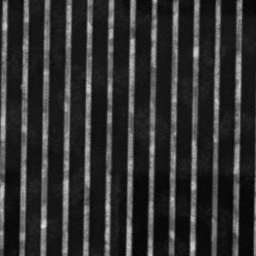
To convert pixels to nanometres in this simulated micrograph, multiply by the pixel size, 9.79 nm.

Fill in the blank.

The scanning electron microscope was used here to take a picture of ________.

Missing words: parallel lines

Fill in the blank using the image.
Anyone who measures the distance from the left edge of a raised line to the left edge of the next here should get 208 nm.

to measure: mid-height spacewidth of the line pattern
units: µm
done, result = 0.167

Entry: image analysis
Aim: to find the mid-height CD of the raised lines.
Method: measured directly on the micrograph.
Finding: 0.0392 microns